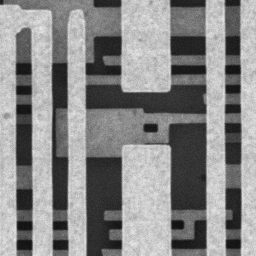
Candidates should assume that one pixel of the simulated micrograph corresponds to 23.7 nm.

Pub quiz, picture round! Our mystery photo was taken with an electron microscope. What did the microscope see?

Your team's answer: wiring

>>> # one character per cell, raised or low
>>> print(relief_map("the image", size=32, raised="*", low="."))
...............******.....**..**
******...*.....******.....**..**
******...*.....******.....**..**
***.**...*.....******.....**..**
**..**...*.....******.....**..**
**..**...*.....******.....**..**
**..**...**....******.....**..**
**..**...**....******.....**..**
**..**...**....******.....**..**
**..**...**....******.....**..**
**..**...**....******.....**..**
**..**...**...............**..**
**..**...**...............**..**
**..**...**...............**..**
**..**...**...............**..**
**..**...**...............**..**
**..**...**...............**..**
**..**...**...............**..**
**..**...**....******.....**..**
**..**...**....******.....**..**
**..**...**....******.....**..**
**..**...**....******.....**..**
**..**...**....******.....**..**
**..**...**....******.....**..**
**..**...**....******.....**..**
**..**...**....******.....**..**
**..**...**....******.....**..**
**..**...**....******.....**..**
**..**...**....******.....**..**
**..**...**....******.....**..**
**..**...**....******.....**..**
**..**...**....******.....**..**